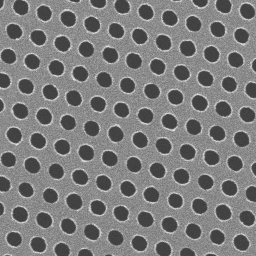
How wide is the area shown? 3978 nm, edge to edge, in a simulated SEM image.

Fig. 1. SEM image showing a regular array of holes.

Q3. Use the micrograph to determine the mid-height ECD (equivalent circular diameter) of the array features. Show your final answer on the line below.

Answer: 243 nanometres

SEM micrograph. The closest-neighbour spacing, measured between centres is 24.5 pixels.